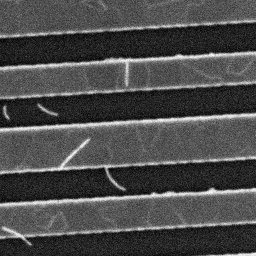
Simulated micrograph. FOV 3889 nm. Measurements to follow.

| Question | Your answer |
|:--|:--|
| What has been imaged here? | lines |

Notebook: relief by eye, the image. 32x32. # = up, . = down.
################################
################################
################################
##################..............
###.............................
................................
................................
................################
################################
################################
##############################..
##############..................
................................
................................
............................####
...........#####################
################################
################################
################################
################################
####################............
#...............................
................................
................................
.................###############
.###############################
################################
################################
####################............
#####...........................
................................
................................